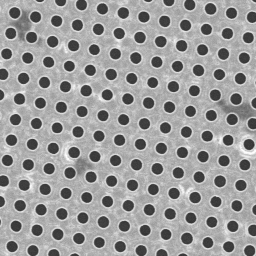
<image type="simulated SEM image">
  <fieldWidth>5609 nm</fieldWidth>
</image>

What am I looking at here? a regular array of holes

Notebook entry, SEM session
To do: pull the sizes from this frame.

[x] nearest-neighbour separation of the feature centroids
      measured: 0.456 µm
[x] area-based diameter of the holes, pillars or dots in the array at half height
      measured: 0.255 microns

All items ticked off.